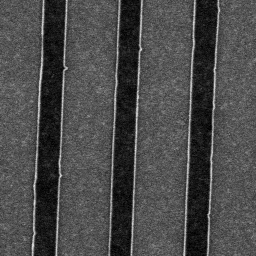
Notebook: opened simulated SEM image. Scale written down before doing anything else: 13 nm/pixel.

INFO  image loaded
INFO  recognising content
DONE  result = one or a few lines or trenches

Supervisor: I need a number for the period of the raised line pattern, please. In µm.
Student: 0.984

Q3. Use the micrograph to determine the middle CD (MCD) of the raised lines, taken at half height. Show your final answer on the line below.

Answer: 0.313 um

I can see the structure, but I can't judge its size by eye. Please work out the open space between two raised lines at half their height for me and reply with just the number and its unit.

0.678 um